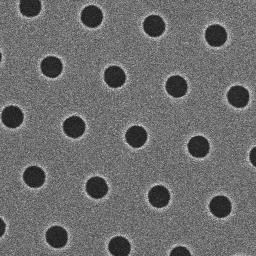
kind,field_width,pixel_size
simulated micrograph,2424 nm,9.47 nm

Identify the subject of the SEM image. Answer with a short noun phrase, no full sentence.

a regular array of holes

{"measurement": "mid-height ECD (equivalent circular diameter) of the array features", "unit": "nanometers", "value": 217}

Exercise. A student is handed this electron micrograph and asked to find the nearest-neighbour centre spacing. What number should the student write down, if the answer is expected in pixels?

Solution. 62.7